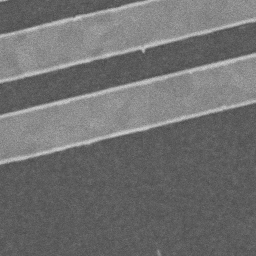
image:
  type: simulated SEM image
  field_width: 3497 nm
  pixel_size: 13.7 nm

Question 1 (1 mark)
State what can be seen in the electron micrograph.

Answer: one or a few lines or trenches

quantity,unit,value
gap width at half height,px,33.5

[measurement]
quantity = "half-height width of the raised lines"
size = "612 nanometers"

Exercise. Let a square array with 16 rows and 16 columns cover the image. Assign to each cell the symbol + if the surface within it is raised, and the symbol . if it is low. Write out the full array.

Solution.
........++++++++
...++++++++++++.
+++++++++++.....
+++++++.........
+++.........++++
.......+++++++++
...++++++++++++.
+++++++++++.....
+++++++.........
+++.............
................
................
................
................
................
................